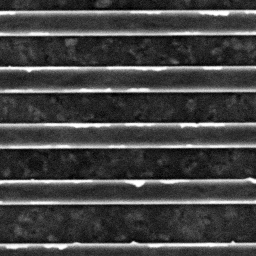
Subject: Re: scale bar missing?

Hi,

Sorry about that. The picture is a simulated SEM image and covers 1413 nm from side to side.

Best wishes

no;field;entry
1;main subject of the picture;parallel lines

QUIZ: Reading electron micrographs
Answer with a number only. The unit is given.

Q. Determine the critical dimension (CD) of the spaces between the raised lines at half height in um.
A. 0.175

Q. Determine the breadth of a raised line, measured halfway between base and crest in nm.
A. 137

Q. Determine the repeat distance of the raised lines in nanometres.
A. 310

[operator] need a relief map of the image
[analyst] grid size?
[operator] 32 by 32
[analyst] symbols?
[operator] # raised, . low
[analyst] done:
................................
..##############################
################################
################################
................................
................................
................................
................................
################################
################################
################################
################................
................................
................................
................................
.......#########################
################################
################################
#...............................
................................
................................
................................
...##.....................######
################################
################################
................................
................................
................................
................................
................................
.........#######################
################################